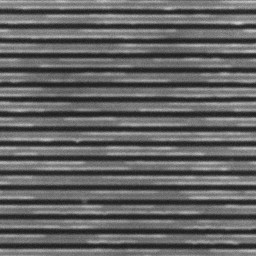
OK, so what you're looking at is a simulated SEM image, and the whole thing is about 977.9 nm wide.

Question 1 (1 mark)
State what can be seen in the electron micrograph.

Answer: parallel lines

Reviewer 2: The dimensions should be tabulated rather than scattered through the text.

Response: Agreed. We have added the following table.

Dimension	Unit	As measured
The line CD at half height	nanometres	33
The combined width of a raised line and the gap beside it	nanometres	56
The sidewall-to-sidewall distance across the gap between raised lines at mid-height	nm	22.9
